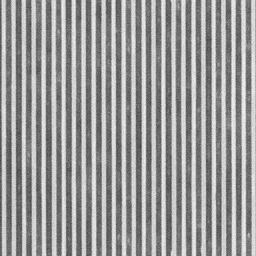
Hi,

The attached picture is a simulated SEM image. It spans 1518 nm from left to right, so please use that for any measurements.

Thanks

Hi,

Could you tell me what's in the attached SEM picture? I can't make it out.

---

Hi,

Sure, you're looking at parallel lines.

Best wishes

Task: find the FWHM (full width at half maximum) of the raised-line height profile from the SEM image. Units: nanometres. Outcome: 23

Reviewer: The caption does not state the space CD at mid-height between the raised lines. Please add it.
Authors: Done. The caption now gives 39.3 nanometres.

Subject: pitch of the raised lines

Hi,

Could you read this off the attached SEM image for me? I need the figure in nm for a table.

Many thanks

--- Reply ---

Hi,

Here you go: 59.2